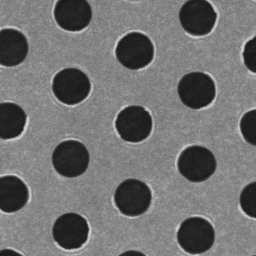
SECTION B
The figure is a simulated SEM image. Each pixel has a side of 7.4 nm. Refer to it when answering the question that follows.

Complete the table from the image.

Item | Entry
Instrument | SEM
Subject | a regular array of holes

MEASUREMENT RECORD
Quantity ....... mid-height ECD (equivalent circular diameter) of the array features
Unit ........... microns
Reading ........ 0.269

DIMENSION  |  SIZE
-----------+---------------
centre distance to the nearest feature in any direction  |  530 nm